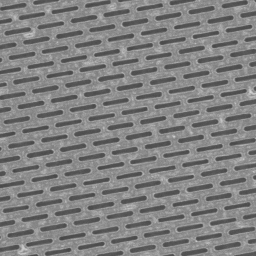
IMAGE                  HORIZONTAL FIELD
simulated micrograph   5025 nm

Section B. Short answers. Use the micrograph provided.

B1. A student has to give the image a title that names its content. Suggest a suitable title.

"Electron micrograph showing a regular array of holes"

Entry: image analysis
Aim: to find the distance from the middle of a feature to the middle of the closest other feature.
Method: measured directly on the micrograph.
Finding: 0.404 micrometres